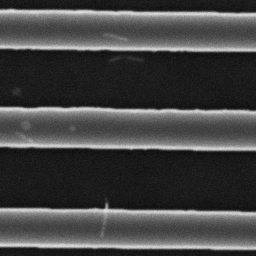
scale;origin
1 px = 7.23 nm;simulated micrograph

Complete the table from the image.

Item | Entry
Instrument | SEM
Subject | lines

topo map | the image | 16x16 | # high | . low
................
################
################
................
................
................
................
################
################
................
................
................
................
################
################
.......#########